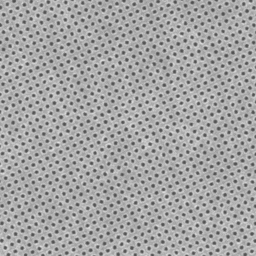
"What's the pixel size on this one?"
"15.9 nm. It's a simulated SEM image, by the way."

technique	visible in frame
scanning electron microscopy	a regular array of holes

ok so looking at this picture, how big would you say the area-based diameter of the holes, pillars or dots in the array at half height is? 67 nm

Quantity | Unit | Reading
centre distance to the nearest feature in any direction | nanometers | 118